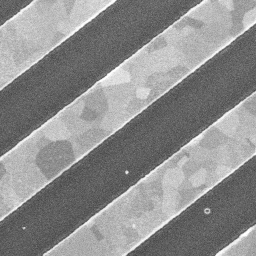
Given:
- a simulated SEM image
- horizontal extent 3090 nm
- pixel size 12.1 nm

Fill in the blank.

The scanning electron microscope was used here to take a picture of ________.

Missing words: lines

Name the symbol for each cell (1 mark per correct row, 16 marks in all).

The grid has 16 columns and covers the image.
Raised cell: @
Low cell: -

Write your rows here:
--@@@@@-----@@@@
@@@@@------@@@@@
@@@@-----@@@@@@-
@@@-----@@@@@---
@------@@@@@----
------@@@@@-----
----@@@@@------@
---@@@@@------@@
--@@@@@-----@@@@
@@@@@@-----@@@@@
@@@@------@@@@@-
@@@-----@@@@@@--
@@-----@@@@@----
------@@@@@-----
-----@@@@@-----@
---@@@@@------@@